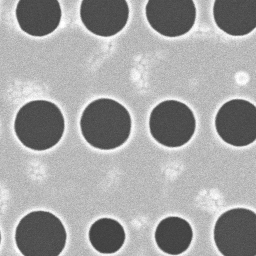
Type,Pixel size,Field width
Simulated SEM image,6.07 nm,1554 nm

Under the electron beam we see holes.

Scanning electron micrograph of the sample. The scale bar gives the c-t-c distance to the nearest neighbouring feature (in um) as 0.404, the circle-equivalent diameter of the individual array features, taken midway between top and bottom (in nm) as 284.